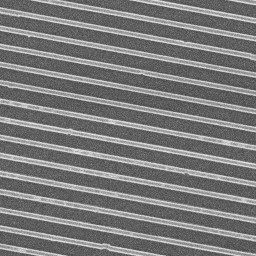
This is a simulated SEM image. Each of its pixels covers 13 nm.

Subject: parallel lines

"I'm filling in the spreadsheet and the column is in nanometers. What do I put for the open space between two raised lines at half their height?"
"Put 177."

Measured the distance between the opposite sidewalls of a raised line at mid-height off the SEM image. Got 55.9 nanometers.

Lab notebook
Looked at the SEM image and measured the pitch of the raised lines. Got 0.232 micrometres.